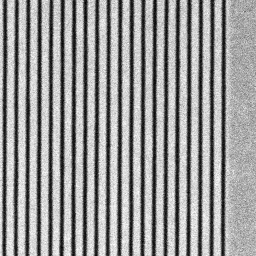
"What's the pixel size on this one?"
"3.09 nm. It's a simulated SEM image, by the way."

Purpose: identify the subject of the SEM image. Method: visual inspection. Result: parallel lines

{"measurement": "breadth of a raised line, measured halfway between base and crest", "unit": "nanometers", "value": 24.3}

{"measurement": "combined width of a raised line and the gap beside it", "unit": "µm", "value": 0.0355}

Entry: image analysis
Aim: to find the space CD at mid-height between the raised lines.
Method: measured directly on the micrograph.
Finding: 0.0112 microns